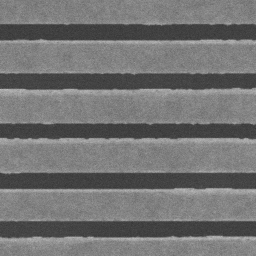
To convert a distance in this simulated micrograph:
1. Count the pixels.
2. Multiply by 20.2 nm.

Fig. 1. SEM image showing lines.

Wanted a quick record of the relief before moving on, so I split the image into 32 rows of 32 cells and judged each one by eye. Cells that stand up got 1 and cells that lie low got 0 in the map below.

11111111111111111111111111111111
11111111111111111111111111111111
11111111111111111111111111111111
00000000000000000000000000000000
00000000000000000000000000000000
11111111111111111111111111111111
11111111111111111111111111111111
11111111111111111111111111111111
11111111111111111111111111111111
00000000000000000000000000000000
00000000000000000000000000000000
11111111111111111111111111111111
11111111111111111111111111111111
11111111111111111111111111111111
11111111111111111111111111111111
00000000000000000000000000000000
00000000000000000000000000000000
00000000000000000000000000000000
11111111111111111111111111111111
11111111111111111111111111111111
11111111111111111111111111111111
11100010000000000000000000000000
00000000000000000000000000000000
00000000000000000000000000000000
11111111111111111111111111111111
11111111111111111111111111111111
11111111111111111111111111111111
11111111111111111111111111111111
00000000000000000000000000000000
00000000000000000000000000000000
11111111111111111111111111111111
11111111111111111111111111111111